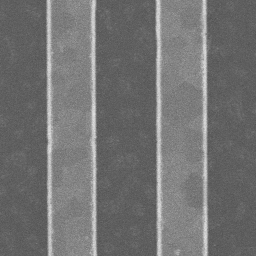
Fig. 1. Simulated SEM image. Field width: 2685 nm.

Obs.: one or a few lines or trenches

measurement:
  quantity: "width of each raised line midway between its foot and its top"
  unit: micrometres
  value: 0.48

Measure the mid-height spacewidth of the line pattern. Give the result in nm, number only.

682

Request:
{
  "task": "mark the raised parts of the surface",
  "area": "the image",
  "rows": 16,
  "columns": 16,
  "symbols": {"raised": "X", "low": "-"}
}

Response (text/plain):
---XXX----XXX---
---XXX----XXX---
---XXX----XXX---
---XXX----XXX---
---XXX----XXX---
---XXX----XXX---
---XXX----XXX---
---XXX----XXX---
---XXX----XXX---
---XXX----XXX---
---XXX----XXX---
---XXX----XXX---
---XXX----XXX---
---XXX----XXX---
---XXX----XXX---
---XXX----XXX---